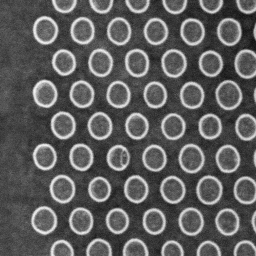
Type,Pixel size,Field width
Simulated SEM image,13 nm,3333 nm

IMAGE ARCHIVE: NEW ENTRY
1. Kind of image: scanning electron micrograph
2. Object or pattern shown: a regular array of raised bodies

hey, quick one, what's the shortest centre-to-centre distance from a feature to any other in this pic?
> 0.47 micrometres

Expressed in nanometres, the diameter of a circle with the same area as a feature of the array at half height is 305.